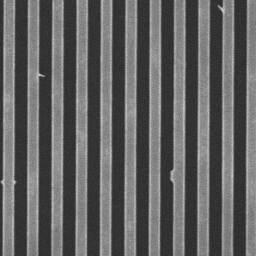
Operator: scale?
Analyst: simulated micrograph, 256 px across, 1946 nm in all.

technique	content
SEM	parallel lines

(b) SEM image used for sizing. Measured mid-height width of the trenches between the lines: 104 nanometres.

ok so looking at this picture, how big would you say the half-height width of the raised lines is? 81.7 nanometers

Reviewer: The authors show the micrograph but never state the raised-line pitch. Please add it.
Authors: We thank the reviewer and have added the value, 185 nm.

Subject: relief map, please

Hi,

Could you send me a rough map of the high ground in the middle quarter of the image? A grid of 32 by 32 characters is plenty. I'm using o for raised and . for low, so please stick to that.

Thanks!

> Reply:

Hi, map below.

...ooo...ooo....oo....oo....oo..
...ooo...ooo....oo....oo....oo..
...ooo...ooo...ooo....oo....oo..
...ooo...ooo...ooo....oo....oo..
...ooo...ooo...ooo....oo....oo..
...ooo...ooo...ooo....oo....oo..
...ooo...ooo...ooo....oo....oo..
...oo....ooo...ooo....oo....oo..
...ooo...ooo...ooo....oo....oo..
...ooo...ooo...ooo....oo....oo..
...ooo...ooo...ooo....oo....oo..
...ooo...ooo...ooo....oo....oo..
...ooo...ooo...ooo....oo....oo..
...ooo...ooo...ooo....oo....oo..
...ooo...ooo...ooo....oo....oo..
...ooo...ooo...ooo....oo....oo..
...ooo...ooo...ooo....oo....oo..
...ooo...ooo...ooo....oo....oo..
...ooo...ooo...ooo....oo....oo..
...ooo...ooo...ooo....oo....oo..
...ooo...ooo...ooo....oo....oo..
...ooo...ooo...ooo....oo....oo..
...ooo...ooo...ooo...ooo....oo..
...ooo...ooo...ooo...ooo....oo..
...ooo...ooo...ooo...ooo....oo..
...ooo...ooo...ooo...ooo....oo..
...ooo...ooo...ooo...ooo...ooo..
...ooo...ooo...ooo...ooo...ooo..
...ooo...ooo...ooo...ooo...ooo..
...ooo...ooo...ooo...ooo...ooo..
...ooo...ooo...ooo...ooo....oo..
...ooo...ooo...ooo...ooo....oo..